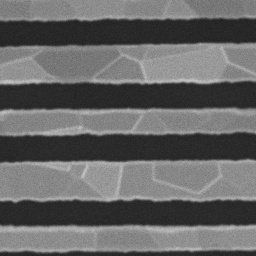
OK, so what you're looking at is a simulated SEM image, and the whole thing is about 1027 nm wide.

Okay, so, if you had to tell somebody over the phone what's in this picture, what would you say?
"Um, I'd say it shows lines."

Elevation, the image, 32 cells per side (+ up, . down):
++++++++++++++++++++++++++++++++
++++++++++++++++++++++++++++++++
++.+++++..++....................
................................
................................
........................++++++++
++++++++++++++++++++++++++++++++
++++++++++++++++++++++++++++++++
++++++++++++++++++++++++++++++++
++++++++++++++++++++++++++++++++
+++...........+.................
................................
................................
................................
++++++++++++++++++++++++++++++++
++++++++++++++++++++++++++++++++
+++++++++++++++++++++++++++++..+
................................
................................
................................
++++++++++++++++++++++++++++++++
++++++++++++++++++++++++++++++++
++++++++++++++++++++++++++++++++
++++++++++++++++++++++++++++++++
++++++++++++++++++++++++++++++++
................................
................................
................................
++++++++++++++++++++++++++++++++
++++++++++++++++++++++++++++++++
++++++++++++++++++++++++++++++++
.....+.+........................